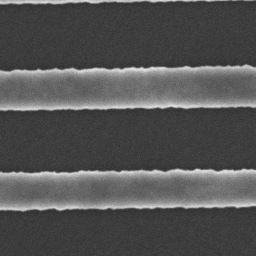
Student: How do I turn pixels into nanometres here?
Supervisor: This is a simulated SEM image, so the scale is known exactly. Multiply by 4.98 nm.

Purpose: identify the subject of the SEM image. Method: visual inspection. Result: lines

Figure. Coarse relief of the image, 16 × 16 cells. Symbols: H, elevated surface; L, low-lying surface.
LLLLLLLLLLLLLLLL
LLLLLLLLLLLLLLLL
LLLLLLLLLLLLLLLL
LLLLLLLLLLLLLLLL
HHHHHHHHHHHHHHHH
HHHHHHHHHHHHHHHH
HHHHHHHHHHHHHHHH
LLLLLLLLLLLLLLLL
LLLLLLLLLLLLLLLL
LLLLLLLLLLLLLLLL
LLLLLLLLLLLLLLLL
HHHHHHHHHHHHHHHH
HHHHHHHHHHHHHHHH
LLLLLLLLLLLLLLLL
LLLLLLLLLLLLLLLL
LLLLLLLLLLLLLLLL